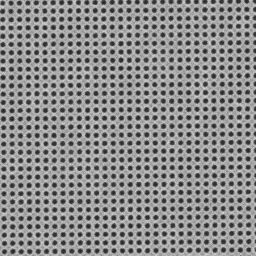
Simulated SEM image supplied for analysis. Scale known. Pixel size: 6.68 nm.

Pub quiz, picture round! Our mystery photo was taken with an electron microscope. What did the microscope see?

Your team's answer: a regular array of holes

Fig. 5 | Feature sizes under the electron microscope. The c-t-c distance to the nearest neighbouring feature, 53.2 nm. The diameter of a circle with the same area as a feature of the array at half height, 5.52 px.